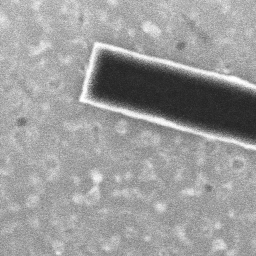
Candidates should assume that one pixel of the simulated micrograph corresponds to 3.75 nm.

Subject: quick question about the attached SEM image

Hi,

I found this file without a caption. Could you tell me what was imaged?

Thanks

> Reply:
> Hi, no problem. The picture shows one or a few lines or trenches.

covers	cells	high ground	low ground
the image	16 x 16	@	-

----------------
----------------
----------------
------@@@-------
-----@@@@@@@@---
-----@@@@@@@@@@@
------@@@@@@@@@@
---------@@@@@@@
-------------@@@
----------------
----------------
----------------
----------------
----------------
----------------
----------------